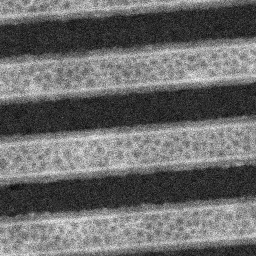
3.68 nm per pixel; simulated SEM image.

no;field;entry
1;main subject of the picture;one or a few lines or trenches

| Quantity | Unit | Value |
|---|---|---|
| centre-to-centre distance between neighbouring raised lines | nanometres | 293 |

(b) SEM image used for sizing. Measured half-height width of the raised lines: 115 nm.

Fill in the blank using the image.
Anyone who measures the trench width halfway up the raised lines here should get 0.179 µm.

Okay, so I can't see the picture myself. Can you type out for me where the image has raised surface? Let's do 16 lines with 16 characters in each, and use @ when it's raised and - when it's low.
@@@@@@@---------
----------------
----------------
--------@@@@@@@@
@@@@@@@@@@@@@@@@
@@@@@@----------
----------------
----------------
-------@@@@@@@@@
@@@@@@@@@@@@@@@@
@@@@@@@---------
----------------
----------------
-------@@@@@@@@@
@@@@@@@@@@@@@@@@
@@@@@@@---------